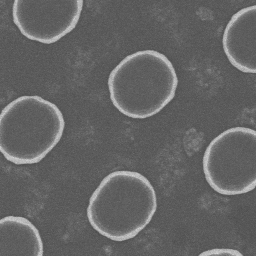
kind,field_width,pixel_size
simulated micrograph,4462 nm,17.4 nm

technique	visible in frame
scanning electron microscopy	raised bodies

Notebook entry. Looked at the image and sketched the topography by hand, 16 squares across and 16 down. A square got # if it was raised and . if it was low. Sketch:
.####...........
.####.........##
..#...........##
........##....##
.......####.....
.......####.....
.##....###......
####............
####..........##
###..........###
.............###
......###....###
......####......
......###.......
##....##........
###.............